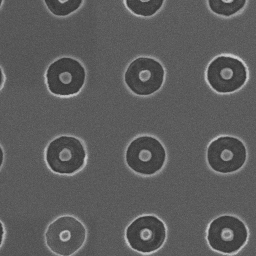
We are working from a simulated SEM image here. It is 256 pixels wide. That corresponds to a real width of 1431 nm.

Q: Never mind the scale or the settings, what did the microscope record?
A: a regular array of ring-shaped grooves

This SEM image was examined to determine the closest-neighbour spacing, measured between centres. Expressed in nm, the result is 439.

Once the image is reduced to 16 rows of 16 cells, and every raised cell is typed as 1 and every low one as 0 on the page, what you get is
1110011100111001
1111111111111111
1111111111111111
1111111111111111
1110011100111001
1110011100111001
1111111111111111
1111111111111111
1111111111111111
1110011100111001
1110011100111001
1111111111111111
1111111111111111
1111111111111111
1111111100111001
1111111100111001